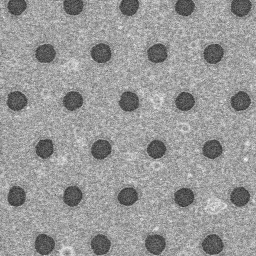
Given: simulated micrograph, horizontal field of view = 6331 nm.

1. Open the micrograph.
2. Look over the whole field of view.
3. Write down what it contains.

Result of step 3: a regular array of holes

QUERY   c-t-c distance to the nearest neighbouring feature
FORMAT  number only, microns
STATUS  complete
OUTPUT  1.35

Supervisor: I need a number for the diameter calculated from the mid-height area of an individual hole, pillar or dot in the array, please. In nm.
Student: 511